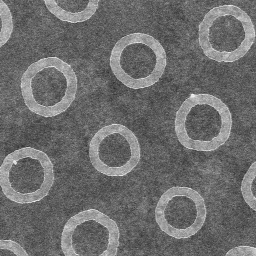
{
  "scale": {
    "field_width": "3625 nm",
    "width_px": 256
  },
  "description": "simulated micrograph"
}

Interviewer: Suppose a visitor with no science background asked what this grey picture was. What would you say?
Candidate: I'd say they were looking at ring-shaped raised bodies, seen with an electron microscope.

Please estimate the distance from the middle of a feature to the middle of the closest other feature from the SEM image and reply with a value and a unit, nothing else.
1.29 µm